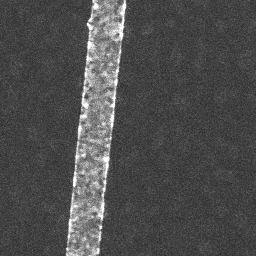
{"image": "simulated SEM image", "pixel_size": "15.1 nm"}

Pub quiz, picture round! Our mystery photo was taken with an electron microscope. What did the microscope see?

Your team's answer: one or a few lines or trenches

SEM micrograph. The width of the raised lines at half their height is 481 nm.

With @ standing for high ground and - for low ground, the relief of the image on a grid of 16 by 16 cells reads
------@@--------
------@@--------
------@@--------
-----@@---------
-----@@---------
-----@@---------
-----@@---------
-----@@---------
-----@@---------
-----@@---------
-----@@---------
-----@@---------
-----@----------
----@@----------
----@@----------
----@@----------